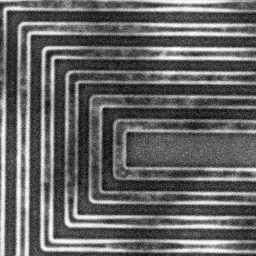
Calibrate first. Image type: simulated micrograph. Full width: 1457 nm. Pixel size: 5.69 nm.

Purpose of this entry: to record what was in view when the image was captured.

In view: groups of lines, slits or small figures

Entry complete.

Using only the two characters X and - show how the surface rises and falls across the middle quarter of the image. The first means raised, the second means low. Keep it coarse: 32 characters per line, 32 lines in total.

--------------------------------
--------------------------------
-XXXXXXXXXXXXXXXXXXXXXXXXXXXXXXX
-XXXXXXXXXXXXXXXXXXXXXXXXXXXXXXX
-XXX---XXXXXXXXXXXXXXXXXXXXXXXXX
-XX-----------------------------
-XX-----------------------------
-XX-----------------------------
-XX----XXXXXXXXXXXXXXXXXXXXXXXXX
-XX----XXXXXXXXXXXXXXXXXXXXXXXXX
-XX----XXXXXXXXXXXXXXXXXXXXXXXXX
-XX----XX-----------------------
-XX----XX-----------------------
-XX----XX-----------------------
-XX----XX----XXXXXXXXXXXXXXXXXXX
-XX----XX----XXXXXXXXXXXXXXXXXXX
-XX----XX----XXXXXXXXXXXXXXXXXXX
-XX---XXX----XX-----------------
-XX---XXX----XX-----------------
-XX---XXX----XX-----------------
-XX---XXX----XX-----------------
-XX---XXX----XX-----------------
-XX---XXX----XX-----------------
-XX---XXX----XX-----------------
-XX---XXX----XX-----------------
-XX---XXX---XXX-----------------
-XX---XXX---XXXXXXXXXXXXXXXXXXXX
-XX---XXX---XXXXXXXXXXXXXXXXXXXX
-XX---XXX----XXXXXXXXXXXXXXXXXXX
-XX---XXX-----------------------
-XX---XXX-----------------------
-XX---XXX-----------------------